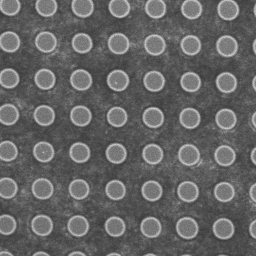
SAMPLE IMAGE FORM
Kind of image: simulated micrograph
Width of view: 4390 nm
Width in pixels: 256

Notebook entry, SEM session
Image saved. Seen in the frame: a regular array of raised bodies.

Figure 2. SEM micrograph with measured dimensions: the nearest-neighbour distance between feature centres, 0.619 µm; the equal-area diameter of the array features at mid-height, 352 nm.